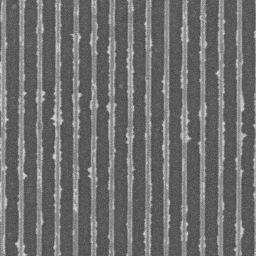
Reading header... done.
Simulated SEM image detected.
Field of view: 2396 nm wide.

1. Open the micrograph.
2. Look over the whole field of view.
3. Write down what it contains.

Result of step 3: parallel lines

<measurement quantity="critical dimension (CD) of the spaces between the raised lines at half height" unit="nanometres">119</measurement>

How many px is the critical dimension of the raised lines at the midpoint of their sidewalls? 5.37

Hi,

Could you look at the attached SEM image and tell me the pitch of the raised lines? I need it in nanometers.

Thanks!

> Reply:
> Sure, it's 170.